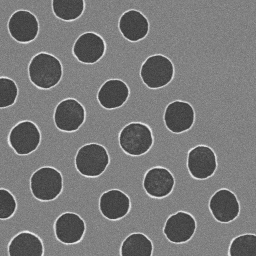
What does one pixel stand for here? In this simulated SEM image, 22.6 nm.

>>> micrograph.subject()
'a regular array of holes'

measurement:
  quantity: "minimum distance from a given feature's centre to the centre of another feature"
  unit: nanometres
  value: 1120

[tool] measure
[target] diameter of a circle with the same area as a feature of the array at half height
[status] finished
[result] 688 nanometers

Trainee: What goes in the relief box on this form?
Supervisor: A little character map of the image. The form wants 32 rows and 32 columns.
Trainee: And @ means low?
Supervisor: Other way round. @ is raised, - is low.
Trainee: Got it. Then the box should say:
@@@@@@@---@@@@@@@@@@@@@@@@@@@@@@
@@--@@@---@@@@@@-@@@@@@@@@@@@@@@
@----@@@-@@@@@@---@@@@@@@@@@@@@@
@----@@@@@@@@@@---@@@@@@@@@@@@@@
@@--@@@@@@--@@@@--@@@@@@@@@@@@@@
@@@@@@@@@----@@@@@@@@@@@@@@@@@@@
@@@@@@@@@----@@@@@@@@@@@@@@@@@@@
@@@@---@@@--@@@@@@---@@@@@@@@@@@
@@@@----@@@@@@@@@@----@@@@@@@@@@
@@@@----@@@@@@@@@@----@@@@@@@@@@
--@@---@@@@@@---@@---@@@@@@@@@@@
--@@@@@@@@@@----@@@@@@@@@@@@@@@@
--@@@@@@-@@@----@@@@@@@@@@@@@@@@
@@@@@@@---@@@-@@@@@@@---@@@@@@@@
@@@@@@@---@@@@@@@@@@@---@@@@@@@@
@@--@@@---@@@@@@--@@@---@@@@@@@@
@----@@@@@@@@@@----@@@-@@@@@@@@@
@----@@@@@@@@@@----@@@@@@@@@@@@@
@@--@@@@@@---@@----@@@@@--@@@@@@
@@@@@@@@@@---@@@@@@@@@@@---@@@@@
@@@@@@@@@@---@@@@@@@@@@@---@@@@@
@@@@@--@@@---@@@@@@--@@@---@@@@@
@@@@----@@@@@@@@@@----@@@@@@@@@@
@@@@----@@@@@@@@@@---@@@@@@@@@@@
--@@---@@@@@@---@@@--@@@@@@--@@@
--@@@@@@@@@@----@@@@@@@@@@----@@
--@@@@@@@@@@@---@@@@@@@@@@----@@
@@@@@@@---@@@@@@@@@@@---@@@--@@@
@@@@@@@----@@@@@@@@@@---@@@@@@@@
@@--@@@---@@@@@@--@@@---@@@@@@--
@----@@@@@@@@@@----@@@@@@@@@@---
@----@@@@@@@@@@----@@@@@@@@@@---